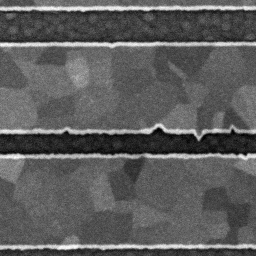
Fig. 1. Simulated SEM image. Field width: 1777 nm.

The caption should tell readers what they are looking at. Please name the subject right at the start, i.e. one or a few lines or trenches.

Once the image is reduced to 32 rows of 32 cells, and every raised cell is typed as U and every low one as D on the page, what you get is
UUUUUUUUUUUUUUUUUUUUUUUUUUUUUUUU
DDDDDDDDDDDDDDDDDDDDDDDDDDDDDDDD
DDDDDDDDDDDDDDDDDDDDDDDDDDDDDDDD
DDDDDDDDDDDDDDDDDDDDDDDDDDDDDDDD
DDDDDDDDDDDDDDDDDDDDDDDDDDDDDDDD
DDDDDDDDDUUDDDDUDDDUUDDDUUUDUDUD
UUUUUUUUUUUUUUUUUUUUUUUUUUUUUUUU
UUUUUUUUUUUUUUUUUUUUUUUUUUUUUUUU
UUUUUUUUUUUUUUUUUUUUUUUUUUUUUUUU
UUUUUUUUUUUUUUUUUUUUUUUUUUUUUUUU
UUUUUUUUUUUUUUUUUUUUUUUUUUUUUUUU
UUUUUUUUUUUUUUUUUUUUUUUUUUUUUUUU
UUUUUUUUUUUUUUUUUUUUUUUUUUUUUUUU
UUUUUUUUUUUUUUUUUUUUUUUUUUUUUUUU
UUUUUUUUUUUUUUUUUUUUUUUUUUUUUUUU
UUUUUUUUUUUUUUUUUUUUUUUUUUUUUUUU
DDUUDDDDDDUDUUUDUUDDDUUUUUDDDDDD
DDDDDDDDDDDDDDDDDDDDDDDDDDDDDDDD
DDDDDDDDDDDDDDDDDDDDDDDDDDDDDDDD
DUDUUUUUDDUUUUUUDUUUDUDDDUUUDDDD
UUUUUUUUUUUUUUUUUUUUUUUUUUUUUUUU
UUUUUUUUUUUUUUUUUUUUUUUUUUUUUUUU
UUUUUUUUUUUUUUUUUUUUUUUUUUUUUUUU
UUUUUUUUUUUUUUUUUUUUUUUUUUUUUUUU
UUUUUUUUUUUUUUUUUUUUUUUUUUUUUUUU
UUUUUUUUUUUUUUUUUUUUUUUUUUUUUUUU
UUUUUUUUUUUUUUUUUUUUUUUUUUUUUUUU
UUUUUUUUUUUUUUUUUUUUUUUUUUUUUUUU
UUUUUUUUUUUUUUUUUUUUUUUUUUUUUUUU
UUUUUUUUUUUUUUUUUUUUUUUUUUUUUUUU
UUUUUUUUUUUUUUUUUUUUUUUUUUUUUUUU
DDDDDDDDDDDDDDDDDDDDDDDDDDDDDDDD